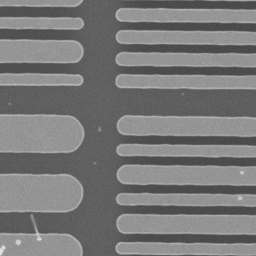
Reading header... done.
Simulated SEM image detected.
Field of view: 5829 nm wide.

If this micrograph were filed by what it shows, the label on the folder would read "groups of lines, slits or small figures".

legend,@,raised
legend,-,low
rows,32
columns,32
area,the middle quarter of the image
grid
----------------@-----@@@@@@@@@@
--------------------------------
--------------------------------
@@@@@--------@@@@@@@@@@@@@@@@@@@
@@@@@--------@@@@@@@@@@@@@@@@@@@
-------------@@@@@@@@@@@@@@@@@@@
--------------------------------
--------------------------------
--------------------------------
--------------------------------
--------------------------------
--------------------------------
--------------------------------
@@-------------@@@@@@@@@@@@@@@@@
@@@@---------@@@@@@@@@@@@@@@@@@@
@@@@---------@@@@@@@@@@@@@@@@@@@
@@@@@---------@@@@@@@@@@@@@@@@@@
@@@@@----------@@@@@@@@@@@@@@@@@
@@@@@---------------------------
@@@@----------------------------
@@@@----------@@@@@@@@@@@@@@@@@@
@@@----------@@@@@@@@@@@@@@@@@@@
--------------@@@@@@@@@@@@@@@@@@
--------------------------------
--------------------------------
---------------@@@@@@@@@---@@---
--------------@@@@@@@@@@@@@@@@@@
-------------@@@@@@@@@@@@@@@@@@@
@@@----------@@@@@@@@@@@@@@@@@@@
@@@@----------@@@@@@@@@@@@@@@@@@
@@@@----------------------------
@@@@@---------------------------